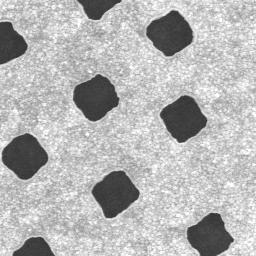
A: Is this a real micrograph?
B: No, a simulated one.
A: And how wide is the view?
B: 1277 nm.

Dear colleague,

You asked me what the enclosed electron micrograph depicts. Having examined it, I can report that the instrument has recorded holes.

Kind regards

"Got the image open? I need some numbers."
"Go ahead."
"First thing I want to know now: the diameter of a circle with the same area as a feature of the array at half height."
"216 nm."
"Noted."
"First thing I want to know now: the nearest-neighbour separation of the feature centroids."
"451 nm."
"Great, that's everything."